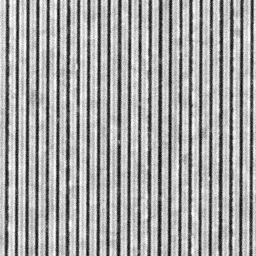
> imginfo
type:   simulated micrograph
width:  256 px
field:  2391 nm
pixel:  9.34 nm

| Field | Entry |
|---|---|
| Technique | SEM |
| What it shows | parallel lines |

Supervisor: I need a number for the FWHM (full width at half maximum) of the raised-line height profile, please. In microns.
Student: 0.056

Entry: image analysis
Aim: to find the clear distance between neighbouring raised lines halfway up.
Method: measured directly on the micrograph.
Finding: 35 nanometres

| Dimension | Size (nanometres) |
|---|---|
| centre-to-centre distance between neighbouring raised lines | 95.1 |